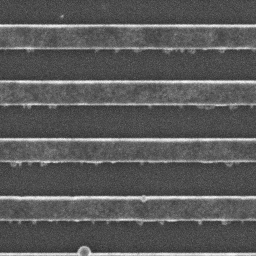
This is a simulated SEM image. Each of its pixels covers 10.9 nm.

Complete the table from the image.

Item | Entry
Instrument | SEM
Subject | lines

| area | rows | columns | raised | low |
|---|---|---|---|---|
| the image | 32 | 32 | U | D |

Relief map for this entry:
DDDDDDDDDDDDDDDDDDDDDDDDDDDDDDDD
DDDDDDDDDDDDDDDDDDDDDDDDDDDDDDDD
DDDDDDDDDDDDDDDDDDDDDDDDDDDDDDDD
UUUUUUUUUUUUUUUUUUUUUUUUUUUUUUUU
UUUUUUUUUUUUUUUUUUUUUUUUUUUUUUUU
UUUUUUUUUUUUUUUUUUUUUUUUUUUUUUUU
DDDDDDDDDDDDDDDDDDDDDDDDDDDDDDDD
DDDDDDDDDDDDDDDDDDDDDDDDDDDDDDDD
DDDDDDDDDDDDDDDDDDDDDDDDDDDDDDDD
DDDDDDDDDDDDDDDDDDDDDDDDDDDDDDDD
UUUUUUUUUUUUUUUUUUUUUUUUUUUUUUUU
UUUUUUUUUUUUUUUUUUUUUUUUUUUUUUUU
UUUUUUUUUUUUUUUUUUUUUUUUUUUUUUUU
DDDDDDDDDDDDDDDDDDDDDDDDDDDDDDDD
DDDDDDDDDDDDDDDDDDDDDDDDDDDDDDDD
DDDDDDDDDDDDDDDDDDDDDDDDDDDDDDDD
DDDDDDDDDDDDDDDDDDDDDDDDDDDDDDDD
UUUUUUUUUUUUUUUUUUUUUUUUUUUUUUUU
UUUUUUUUUUUUUUUUUUUUUUUUUUUUUUUU
UUUUUUUUUUUUUUUUUUUUUUUUUUUUUUUU
DDDDDDDDDDDDDDDDDDDDDDDDDDDDDDDD
DDDDDDDDDDDDDDDDDDDDDDDDDDDDDDDD
DDDDDDDDDDDDDDDDDDDDDDDDDDDDDDDD
DDDDDDDDDDDDDDDDDDDDDDDDDDDDDDDD
DDDDDDDDDDDDDDDDDDDDDDDDDDDDDDDD
UUUUUUUUUUUUUUUUUUUUUUUUUUUUUUUU
UUUUUUUUUUUUUUUUUUUUUUUUUUUUUUUU
DDDDDDUDDUDDDDDDDDUUUUDDUDDDDDDD
DDDDDDDDDDDDDDDDDDDDDDDDDDDDDDDD
DDDDDDDDDDDDDDDDDDDDDDDDDDDDDDDD
DDDDDDDDDDDDDDDDDDDDDDDDDDDDDDDD
DDDDDDDDDDUDDDDDDDDDDDDDDDDDDDDD